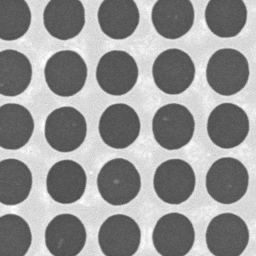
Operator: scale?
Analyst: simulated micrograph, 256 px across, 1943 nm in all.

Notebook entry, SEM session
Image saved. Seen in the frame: a regular array of holes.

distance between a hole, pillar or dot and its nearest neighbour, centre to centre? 401 nanometers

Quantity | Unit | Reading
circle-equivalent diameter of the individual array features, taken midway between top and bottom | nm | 338